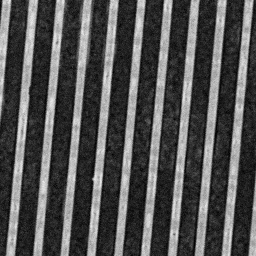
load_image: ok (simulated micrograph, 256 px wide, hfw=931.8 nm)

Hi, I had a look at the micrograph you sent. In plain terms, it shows parallel lines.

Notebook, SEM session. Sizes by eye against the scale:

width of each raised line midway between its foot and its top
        28.5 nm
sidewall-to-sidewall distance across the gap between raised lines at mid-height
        0.0693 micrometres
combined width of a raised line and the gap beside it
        97.7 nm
